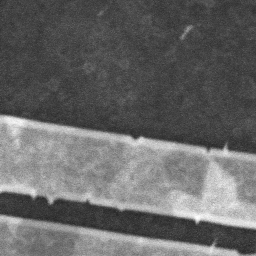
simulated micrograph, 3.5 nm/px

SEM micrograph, one or a few lines or trenches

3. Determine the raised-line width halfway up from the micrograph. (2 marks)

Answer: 232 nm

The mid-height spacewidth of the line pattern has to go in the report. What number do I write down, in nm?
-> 109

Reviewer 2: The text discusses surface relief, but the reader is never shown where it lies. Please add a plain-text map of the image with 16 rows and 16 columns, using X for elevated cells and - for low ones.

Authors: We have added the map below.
----------------
----------------
----------------
----------------
----------------
----------------
----------------
X---------------
XXXXXXX---------
XXXXXXXXXXXXX---
XXXXXXXXXXXXXXXX
XXXXXXXXXXXXXXXX
------XXXXXXXXXX
------------XXXX
XXXXXX----------
XXXXXXXXXXXX----